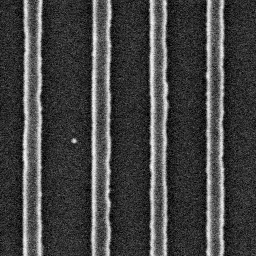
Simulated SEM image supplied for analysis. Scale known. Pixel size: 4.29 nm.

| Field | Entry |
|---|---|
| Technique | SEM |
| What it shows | lines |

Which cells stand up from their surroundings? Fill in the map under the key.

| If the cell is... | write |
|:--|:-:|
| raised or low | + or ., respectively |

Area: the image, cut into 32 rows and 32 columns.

...++.......++.....++.....++....
...++.......++.....++.....++....
...++.......++.....++.....++....
...++.......++.....++.....++....
...++.......++.....++.....++....
...++.......++.....++.....++....
...++.......++.....++.....++....
...++.......++.....++.....++....
...++.......++.....++.....++....
...++.......++.....++.....++....
...++.......++.....++.....++....
...++.......++.....++.....++....
...++.......++.....++.....++....
...++.......++.....++.....++....
...++.......++.....++.....++....
...++.......++.....++.....++....
...++.......++.....++.....++....
...++.......++.....++.....++....
...++.......++.....++.....++....
...++.......++.....++.....++....
...++.......++.....++.....++....
...++.......++.....++.....++....
...++.......++.....++.....++....
...++.......++.....++.....++....
...++.......++.....++.....++....
...++.......++.....++.....++....
...++.......++.....++.....++....
...++.......++.....++.....++....
...++.......++.....++.....++....
...++.......++.....++.....++....
...++.......++.....++.....++....
...++.......++.....++.....++....